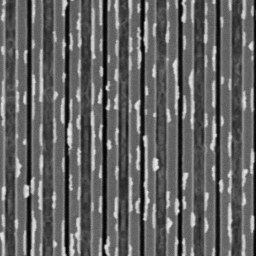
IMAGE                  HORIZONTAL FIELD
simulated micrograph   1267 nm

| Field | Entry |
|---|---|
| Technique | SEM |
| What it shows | parallel lines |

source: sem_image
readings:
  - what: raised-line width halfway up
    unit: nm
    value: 55.7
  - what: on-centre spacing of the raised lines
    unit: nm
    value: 93.4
